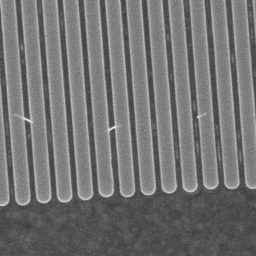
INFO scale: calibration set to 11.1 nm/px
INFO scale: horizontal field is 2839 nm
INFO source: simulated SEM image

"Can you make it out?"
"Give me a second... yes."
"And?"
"parallel lines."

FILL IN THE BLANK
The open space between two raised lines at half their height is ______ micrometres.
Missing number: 0.0705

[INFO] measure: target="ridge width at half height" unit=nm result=163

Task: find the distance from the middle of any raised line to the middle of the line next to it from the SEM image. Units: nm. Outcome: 232